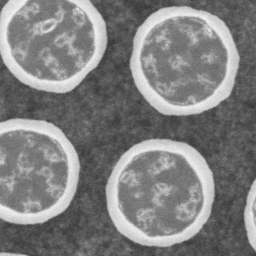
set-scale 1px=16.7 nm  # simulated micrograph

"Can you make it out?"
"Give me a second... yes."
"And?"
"raised bodies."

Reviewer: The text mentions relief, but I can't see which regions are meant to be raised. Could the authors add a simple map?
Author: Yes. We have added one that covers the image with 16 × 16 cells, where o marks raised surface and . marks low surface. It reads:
.ooooo..........
oooooo...oooo...
oooooo...ooooo..
oooooo..oooooo..
.oooo....ooooo..
.........ooooo..
..........ooo...
................
oooo............
oooo....oooo....
ooooo..oooooo...
ooooo..oooooo...
oooo...oooooo...
.oo....oooooo...
........oooo....
................